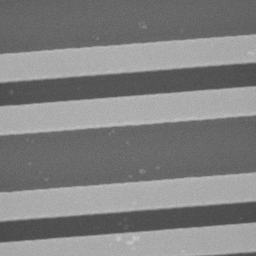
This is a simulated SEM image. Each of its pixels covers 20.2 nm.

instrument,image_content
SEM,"lines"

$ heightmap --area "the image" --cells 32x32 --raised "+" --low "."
................................
................................
................................
................................
..............................++
................++++++++++++++++
....++++++++++++++++++++++++++++
++++++++++++++++++++++++++++++++
++++++++++++++++++++++..........
+++++++++.......................
................................
......................++++++++++
..........++++++++++++++++++++++
++++++++++++++++++++++++++++++++
+++++++++++++++++++++++++++++...
+++++++++++++++++...............
++++............................
................................
................................
................................
................................
................................
....................++++++++++++
.......+++++++++++++++++++++++++
++++++++++++++++++++++++++++++++
+++++++++++++++++++++++++++.....
++++++++++++++..................
++..............................
.......................+++++++++
..........++++++++++++++++++++++
++++++++++++++++++++++++++++++++
+++++++++++++++++++++++++++++++.